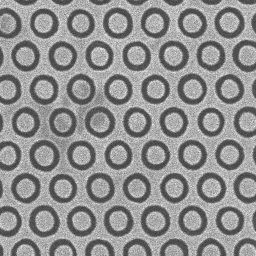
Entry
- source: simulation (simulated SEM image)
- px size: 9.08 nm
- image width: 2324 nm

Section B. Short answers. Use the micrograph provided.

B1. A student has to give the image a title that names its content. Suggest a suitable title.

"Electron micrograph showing a regular array of ring-shaped grooves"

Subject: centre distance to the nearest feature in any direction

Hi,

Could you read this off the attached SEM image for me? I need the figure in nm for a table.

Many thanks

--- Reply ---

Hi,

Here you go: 334